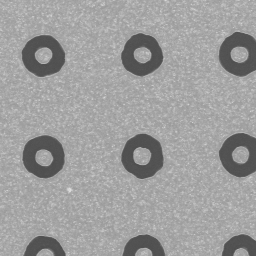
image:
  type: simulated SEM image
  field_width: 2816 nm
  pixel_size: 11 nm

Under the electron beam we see ring-shaped grooves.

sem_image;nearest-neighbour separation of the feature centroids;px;98.8